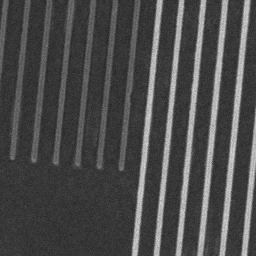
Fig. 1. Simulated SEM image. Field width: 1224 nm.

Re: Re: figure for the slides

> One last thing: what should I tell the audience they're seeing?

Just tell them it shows parallel lines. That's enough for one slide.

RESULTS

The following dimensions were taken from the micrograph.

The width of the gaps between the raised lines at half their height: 84.4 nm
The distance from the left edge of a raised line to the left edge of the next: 104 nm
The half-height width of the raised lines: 0.0202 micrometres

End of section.